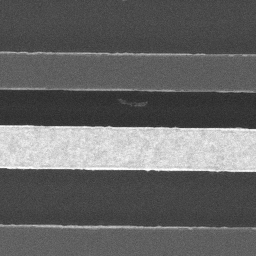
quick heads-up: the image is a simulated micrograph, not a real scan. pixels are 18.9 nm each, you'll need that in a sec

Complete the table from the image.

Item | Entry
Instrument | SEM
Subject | lines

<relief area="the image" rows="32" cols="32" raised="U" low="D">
DDDDDDDDDDDDDDDDDDDDDDDDDDDDDDDD
DDDDDDDDDDDDDDDDDDDDDDDDDDDDDDDD
DDDDDDDDDDDDDDDDDDDDDDDDDDDDDDDD
DDDDDDDDDDDDDDDDDDDDDDDDDDDDDDDD
DDDDDDDDDDDDDDDDDDDDDDDDDDDDDDDD
DDDDDDDDDDDDDDDDDDDDDDDDDDDDDDDD
DDDDDDDDDDDDDDDDDDDDDDDDDDDDDDDD
UUUUUUUUUUUUUUUUUUUUUUUUUUUUUUUU
UUUUUUUUUUUUUUUUUUUUUUUUUUUUUUUU
UUUUUUUUUUUUUUUUUUUUUUUUUUUUUUUU
UUUUUUUUUUUUUUUUUUUUUUUUUUUUUUUU
DDDDDDDDDDDDDDDDDDDDDDDDDDDDDDDD
DDDDDDDDDDDDDDDDDDDDDDDDDDDDDDDD
DDDDDDDDDDDDDDDDDDDDDDDDDDDDDDDD
DDDDDDDDDDDDDDDDDDDDDDDDDDDDDDDD
DDDDDDDDDDDDDDDDDDDDDDDDDDDDDDDD
UUUUUUUUUUUUUUUUUUUUUUUUUUUUUUUU
UUUUUUUUUUUUUUUUUUUUUUUUUUUUUUUU
UUUUUUUUUUUUUUUUUUUUUUUUUUUUUUUU
UUUUUUUUUUUUUUUUUUUUUUUUUUUUUUUU
UUUUUUUUUUUUUUUUUUUUUUUUUUUUUUUU
DDDDDDDDDDDDDDDDDDDDDDDDDDDDDDDD
DDDDDDDDDDDDDDDDDDDDDDDDDDDDDDDD
DDDDDDDDDDDDDDDDDDDDDDDDDDDDDDDD
DDDDDDDDDDDDDDDDDDDDDDDDDDDDDDDD
DDDDDDDDDDDDDDDDDDDDDDDDDDDDDDDD
DDDDDDDDDDDDDDDDDDDDDDDDDDDDDDDD
DDDDDDDDDDDDDDDDDDDDDDDDDDDDDDDD
UUUUUUUUUUUUUUUUUUUUUUUUUUDUUDDD
UUUUUUUUUUUUUUUUUUUUUUUUUUUUUUUU
UUUUUUUUUUUUUUUUUUUUUUUUUUUUUUUU
UUUUUUUUUUUUUUUUUUUUUUUUUUUUUUUU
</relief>